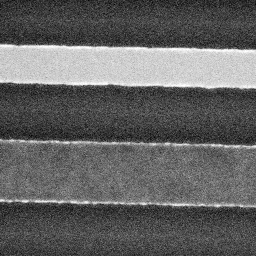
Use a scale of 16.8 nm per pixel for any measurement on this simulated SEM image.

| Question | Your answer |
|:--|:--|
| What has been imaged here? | lines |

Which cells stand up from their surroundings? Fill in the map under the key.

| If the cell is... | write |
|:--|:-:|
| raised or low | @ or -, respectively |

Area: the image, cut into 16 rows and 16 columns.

----------------
----------------
----------------
@@@@@@@@@@@@@@@@
@@@@@@@@@@@@@@@@
----------------
----------------
----------------
----------------
@@@@@@@@@@@@@@@@
@@@@@@@@@@@@@@@@
@@@@@@@@@@@@@@@@
@@@@@@@@@@@@@@@@
----------------
----------------
----------------